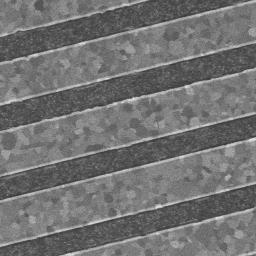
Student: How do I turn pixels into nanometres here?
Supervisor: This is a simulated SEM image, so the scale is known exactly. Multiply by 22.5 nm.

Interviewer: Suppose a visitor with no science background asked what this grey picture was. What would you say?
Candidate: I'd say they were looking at one or a few lines or trenches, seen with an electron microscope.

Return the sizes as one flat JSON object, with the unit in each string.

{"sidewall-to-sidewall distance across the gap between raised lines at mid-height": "556 nm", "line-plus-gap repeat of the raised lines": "1530 nanometres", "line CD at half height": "955 nm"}